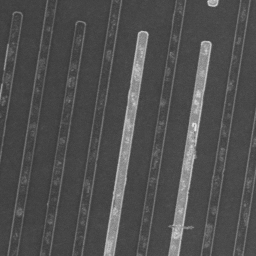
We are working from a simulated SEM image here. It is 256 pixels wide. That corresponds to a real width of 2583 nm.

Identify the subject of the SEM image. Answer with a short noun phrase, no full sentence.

parallel lines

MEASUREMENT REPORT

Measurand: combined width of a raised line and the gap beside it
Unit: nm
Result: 321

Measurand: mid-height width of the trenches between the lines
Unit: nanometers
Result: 227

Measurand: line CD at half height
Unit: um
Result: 0.0947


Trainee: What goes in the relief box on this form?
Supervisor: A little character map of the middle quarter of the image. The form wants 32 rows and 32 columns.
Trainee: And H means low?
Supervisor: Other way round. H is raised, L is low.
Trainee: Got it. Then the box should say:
LHHHLLLLLHHHLLLLLHHHLLLLLLHHLLLL
LHHLLLLLLHHHLLLLLHHHLLLLLHHHLLLL
LHHLLLLLLHHLLLLLLHHLLLLLLHHLLLLL
LHHLLLLLLHHLLLLLLHHLLLLLLHHLLLLL
LHHLLLLLLHHLLLLLLHHLLLLLLHHLLLLL
LHHLLLLLLHHLLLLLLHHLLLLLLHHLLLLL
HHHLLLLLLHHLLLLLLHHLLLLLLHHLLLLL
HHHLLLLLHHHLLLLLHHHLLLLLHHHLLLLL
HHLLLLLLHHLLLLLLHHLLLLLLHHHLLLLL
HHLLLLLLHHLLLLLLHHLLLLLLHHLLLLLL
HHLLLLLLHHLLLLLLHHLLLLLLHHLLLLLL
HHLLLLLLHHLLLLLLHHLLLLLLHHLLLLLL
HHLLLLLLHHLLLLLLHHLLLLLLHHLLLLLL
HHLLLLLHHHLLLLLHHHLLLLLLHHLLLLLL
HLLLLLLHHHLLLLLHHHLLLLLHHHLLLLLH
HLLLLLLHHLLLLLLHHLLLLLLHHLLLLLLH
HLLLLLLHHLLLLLLHHLLLLLLHHLLLLLLH
HLLLLLLHHLLLLLLHHLLLLLLHHLLLLLLH
HLLLLLLHHLLLLLLHHLLLLLLHHLLLLLLH
HLLLLLLHHLLLLLLHHLLLLLLHHLLLLLLH
HLLLLLHHHLLLLLHHHLLLLLHHHLLLLLHH
LLLLLLHHLLLLLLHHLLLLLLHHLLLLLLHH
LLLLLLHHLLLLLLHHLLLLLLHHLLLLLLHH
LLLLLLHHLLLLLLHHLLLLLLHHLLLLLLHH
LLLLLLHHLLLLLLHHLLLLLLHHLLLLLLHH
LLLLLLHHLLLLLLHHLLLLLLHHLLLLLLHH
LLLLLHHHLLLLLHHHLLLLLHHHLLLLLLHH
LLLLLHHLLLLLLHHHLLLLLHHHLLLLLHHH
LLLLLHHLLLLLLHHLLLLLLHHLLLLLLHHL
LLLLLHHLLLLLLHHLLLLLLHHLLLLLLHHL
LLLLLHHLLLLLLHHLLLLLLHHLLLLLLHHL
LLLLLHHLLLLLLHHLLLLLLHHLLLLLLHHL